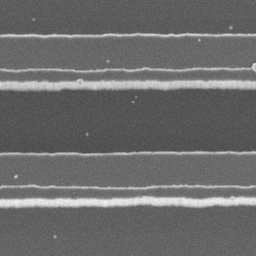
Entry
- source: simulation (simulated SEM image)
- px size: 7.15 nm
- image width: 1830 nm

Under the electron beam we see lines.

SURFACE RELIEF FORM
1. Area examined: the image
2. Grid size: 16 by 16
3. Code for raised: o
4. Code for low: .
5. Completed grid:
................
................
oooooooooooooooo
oooooooooooooooo
oooooooooooooooo
................
................
................
................
................
oooooooooooooooo
oooooooooooooooo
oooooooooooooooo
................
................
................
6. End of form